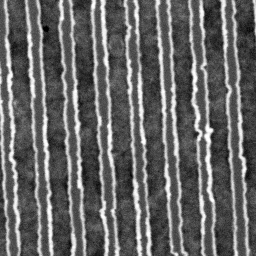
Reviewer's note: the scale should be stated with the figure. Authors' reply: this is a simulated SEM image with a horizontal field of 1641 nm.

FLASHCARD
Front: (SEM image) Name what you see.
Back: parallel lines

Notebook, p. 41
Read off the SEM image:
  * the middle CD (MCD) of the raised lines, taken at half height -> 77.6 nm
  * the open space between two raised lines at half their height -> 132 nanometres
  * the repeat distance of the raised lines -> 32.5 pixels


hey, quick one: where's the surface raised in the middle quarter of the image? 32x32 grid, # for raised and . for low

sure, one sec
###.....###.....###.....###.....
###.....###.....###.....###.....
##......###.....###.....###.....
###.....###.....###.....###.....
###.....###.....###.....###.....
###.....###.....###.....####....
###.....###.....###.....###.....
###.....###......###.....###....
###.....###......##......###....
###.....###......##......###....
###.....####.....###.....###....
###.....###......###.....##.....
###......##......###.....###....
###......##......###.....###....
####.....###.....##......###....
.###.....##......###.....###....
.##......##......###.....###....
.##......###.....###.....###....
.###.....###.....###.....###....
.###.....###.....###.....###....
.###.....###.....###.....###....
.###.....###.....###.....###....
.###.....###.....###......##....
.###.....###.....###......##....
.###.....###......###....###....
.###.....###......##.....###....
.###.....###......##.....####...
.###.....###......##.....###....
..##.....####....###......##....
.###......###....###......###...
.###......##......###.....###...
.####.....##......###.....###...